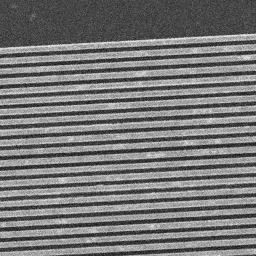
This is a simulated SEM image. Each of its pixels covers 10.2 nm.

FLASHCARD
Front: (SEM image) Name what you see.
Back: parallel lines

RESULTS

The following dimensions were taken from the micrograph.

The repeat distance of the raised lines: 104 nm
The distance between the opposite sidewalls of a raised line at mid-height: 5.24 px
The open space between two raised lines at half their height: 45.8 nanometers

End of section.